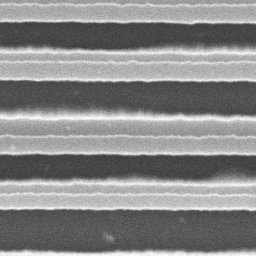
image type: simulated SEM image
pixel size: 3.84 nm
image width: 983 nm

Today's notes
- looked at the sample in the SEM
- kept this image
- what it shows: lines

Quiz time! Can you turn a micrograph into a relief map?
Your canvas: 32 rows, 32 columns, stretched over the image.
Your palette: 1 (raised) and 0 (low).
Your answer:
11111111111111111111111111111111
11111111111111111111111111111111
11111111111111111111111111111111
00000000000000000000000000000000
00000000000000000000000000000000
00000000000000000000000000000000
11111111111110000111111111111111
11111111111111111111111111111111
11111111111111111111111111111111
11111111111111111111111111111111
00000000000000000000000000000000
00000000000000000000000000000000
00000000000000000000000000000000
00000000000000000000000000000000
00100000000000000000000000000000
11111111111111111111111111111111
11111111111111111111111111111111
11111111111111111111111111111111
11111111111111111111111111111111
00000000000000000000000000000000
00000000000000000000000000000000
00000000000000000000000000000000
00000000000000000000000000000000
11111111111111111111111111111111
11111111111111111111111111111111
11111111111111111111111111111111
00000000000000000000000000000000
00000000000000000000000000000000
00000000000000000000000000000000
00000000000000000000000000000000
00000000000000000000000000000000
00000000000000000000000000000000